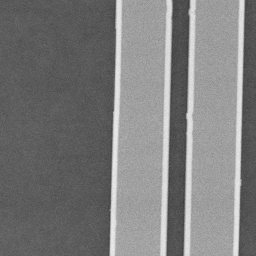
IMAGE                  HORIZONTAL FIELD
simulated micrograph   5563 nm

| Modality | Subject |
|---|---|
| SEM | one or a few lines or trenches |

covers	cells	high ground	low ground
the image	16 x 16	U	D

DDDDDDDUUUUDUUUD
DDDDDDDUUUUDUUUD
DDDDDDDUUUDDUUUD
DDDDDDDUUUDDUUUD
DDDDDDDUUUDDUUUD
DDDDDDDUUUDDUUUD
DDDDDDDUUUDDUUUD
DDDDDDDUUUDDUUUD
DDDDDDDUUUDDUUUD
DDDDDDDUUUDDUUUD
DDDDDDDUUUDDUUUD
DDDDDDDUUUDDUUUD
DDDDDDDUUUDDUUUD
DDDDDDDUUUDDUUUD
DDDDDDDUUUDDUUUD
DDDDDDDUUUDDUUUD